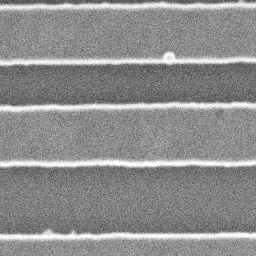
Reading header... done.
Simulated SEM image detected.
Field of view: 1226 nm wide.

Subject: lines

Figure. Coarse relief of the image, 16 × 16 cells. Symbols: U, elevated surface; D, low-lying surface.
UUUUUUUUUUUUUUUU
UUUUUUUUUUUUUUUU
UUUUUUUUUUUUUUUU
UUUUUUUUUUUUUUUU
DDDDDDDDDDDDDDDD
DDDDDDDDDDDDDDDD
DDDDDDDDDDDDDDDD
UUUUUUUUUUUUUUUU
UUUUUUUUUUUUUUUU
UUUUUUUUUUUUUUUU
DDDDDDDDDDDDDDDD
DDDDDDDDDDDDDDDD
DDDDDDDDDDDDDDDD
DDDDDDDDDDDDDDDD
DDDDDDDDDDDDDDDD
UUUUUUUUUUUUUUUU